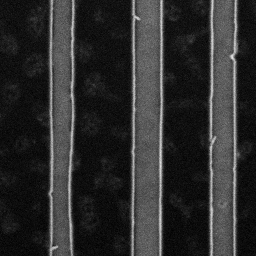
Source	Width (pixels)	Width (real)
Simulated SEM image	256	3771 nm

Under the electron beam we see one or a few lines or trenches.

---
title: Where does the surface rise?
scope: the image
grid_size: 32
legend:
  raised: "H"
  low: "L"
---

HHHHHHHLLHHHHHHHHLLLHHHHHHHLLHHH
HHHHHHLLLHHHHHHHHLLLHHHHHHHLLHHH
HHHHHHLLLHHHHHHHHLLLHHHHHHHLLHHH
HHHHHHLLLHHHHHHHHLLLHHHHHHHLLHHH
HHHHHHLLLHHHHHHHHLLLHHHHHHHLLHHH
HHHHHHLLLHHHHHHHHLLLHHHHHHHLLHHH
HHHHHHLLLHHHHHHHHLLLHHHHHHLLLHHH
HHHHHHLLLHHHHHHHHLLLHHHHHHLLLHHH
HHHHHHLLLHHHHHHHHLLLHHHHHHLLLHHH
HHHHHHLLLHHHHHHHHLLLHHHHHHLLLHHH
HHHHHHLLLHHHHHHHHLLLHHHHHHLLLHHH
HHHHHHLLLHHHHHHHHLLLHHHHHHLLLHHH
HHHHHHLLLHHHHHHHHLLLHHHHHHLLLHHH
HHHHHHLLLHHHHHHHHLLLHHHHHHLLLHHH
HHHHHHLLLHHHHHHHHLLLHHHHHHLLLHHH
HHHHHHLLLHHHHHHHHLLLHHHHHHLLLHHH
HHHHHHLLLHHHHHHHHLLLHHHHHHLLLHHH
HHHHHHLLLHHHHHHHHLLLHHHHHHHLLHHH
HHHHHHLLLHHHHHHHHLLLHHHHHHLLLHHH
HHHHHHLLLHHHHHHHHLLLHHHHHHLLLHHH
HHHHHHLLLHHHHHHHHLLLHHHHHHLLLHHH
HHHHHHLLLHHHHHHHHLLLHHHHHHLLLHHH
HHHHHHLLLHHHHHHHHLLLHHHHHHLLLHHH
HHHHHHLLLHHHHHHHHLLLHHHHHHLLLHHH
HHHHHHLLLHHHHHHHHLLLHHHHHHLLLHHH
HHHHHHLLLHHHHHHHHLLLHHHHHHLLLHHH
HHHHHHLLLHHHHHHHHLLLHHHHHHHLLHHH
HHHHHHLLLHHHHHHHHLLLHHHHHHLLLHHH
HHHHHHLLLHHHHHHHHLLLHHHHHHLLLHHH
HHHHHHLLLHHHHHHHHLLLHHHHHHLLLHHH
HHHHHHHLLHHHHHHHHLLLHHHHHHHLLHHH
HHHHHHHLLHHHHHHHHLLLHHHHHHHLLHHH